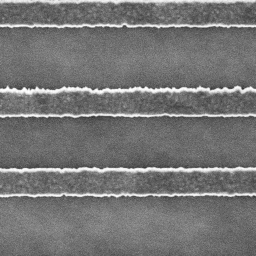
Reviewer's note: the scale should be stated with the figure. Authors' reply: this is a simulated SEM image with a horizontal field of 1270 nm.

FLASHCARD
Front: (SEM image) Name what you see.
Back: lines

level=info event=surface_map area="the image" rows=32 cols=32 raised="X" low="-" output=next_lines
XXXXXXXXXXXXXXXXXXXXXXXXXXXXXXXX
XXXXXXXXXXXXXXXXXXXXXXXXXXXXXXXX
XXXXXXXXXXXXXXXXXXXXXXXXXXXXXXXX
--------------------------------
--------------------------------
--------------------------------
--------------------------------
--------------------------------
--------------------------------
--------------------------------
--------------------------------
XXXXXXXXXXXXXXXXXXXXXXXXXXXXXXXX
XXXXXXXXXXXXXXXXXXXXXXXXXXXXXXXX
XXXXXXXXXXXXXXXXXXXXXXXXXXXXXXXX
X--XXX-X-X------X-----------X---
--------------------------------
--------------------------------
--------------------------------
--------------------------------
--------------------------------
--------------------------------
XXXXXXXXXXXXXXXXXXXXXXXXXXXXXXXX
XXXXXXXXXXXXXXXXXXXXXXXXXXXXXXXX
XXXXXXXXXXXXXXXXXXXXXXXXXXXXXXXX
X-------------X-----------------
--------------------------------
--------------------------------
--------------------------------
--------------------------------
--------------------------------
--------------------------------
--------------------------------